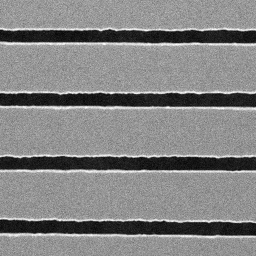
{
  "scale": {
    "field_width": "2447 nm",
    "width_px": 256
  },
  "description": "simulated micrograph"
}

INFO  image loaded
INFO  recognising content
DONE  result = lines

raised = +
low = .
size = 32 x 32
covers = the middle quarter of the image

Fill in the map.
++++++++++++++++++++++++++++++++
++++++++++++++++++++++++++++++++
++++++++++++++++++++++++++++++++
++++++++++++++++++++++++++++++++
++++++++++++++++++++++++++++++++
++++++++++++++++++++++++++++++++
++++++++++++++++++++++++++++++++
................................
................................
................................
................................
++++++++++++++++++++++++++++++++
++++++++++++++++++++++++++++++++
++++++++++++++++++++++++++++++++
++++++++++++++++++++++++++++++++
++++++++++++++++++++++++++++++++
++++++++++++++++++++++++++++++++
++++++++++++++++++++++++++++++++
++++++++++++++++++++++++++++++++
++++++++++++++++++++++++++++++++
++++++++++++++++++++++++++++++++
++++++++++++++++++++++++++++++++
++++++++++++++++++++++++++++++++
................................
................................
................................
................................
++++++++++++++++++++++++++++++++
++++++++++++++++++++++++++++++++
++++++++++++++++++++++++++++++++
++++++++++++++++++++++++++++++++
++++++++++++++++++++++++++++++++